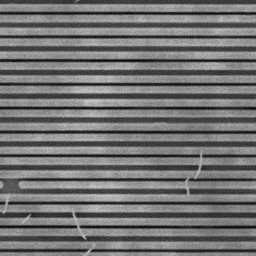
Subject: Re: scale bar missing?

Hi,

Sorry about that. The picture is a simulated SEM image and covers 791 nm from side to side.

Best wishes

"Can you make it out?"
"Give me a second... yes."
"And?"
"parallel lines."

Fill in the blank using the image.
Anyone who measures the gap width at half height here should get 15.4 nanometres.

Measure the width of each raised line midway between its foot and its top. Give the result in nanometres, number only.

23.5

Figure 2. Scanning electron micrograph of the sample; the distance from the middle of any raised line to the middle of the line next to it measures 0.0367 um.